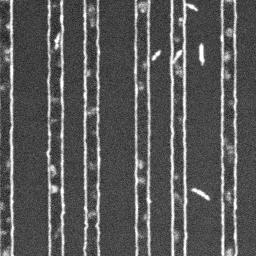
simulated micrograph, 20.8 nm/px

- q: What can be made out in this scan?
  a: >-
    parallel lines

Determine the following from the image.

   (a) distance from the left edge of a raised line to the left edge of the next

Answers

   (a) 902 nm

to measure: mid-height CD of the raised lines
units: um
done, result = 0.281